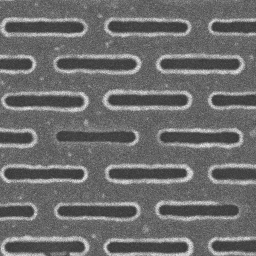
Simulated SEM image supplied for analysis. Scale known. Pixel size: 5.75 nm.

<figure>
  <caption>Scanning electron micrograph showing a regular array of holes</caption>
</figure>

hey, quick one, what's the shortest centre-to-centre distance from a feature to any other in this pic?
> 362 nm